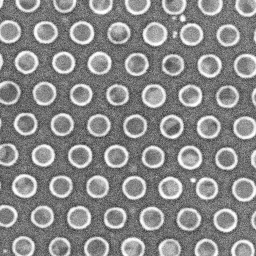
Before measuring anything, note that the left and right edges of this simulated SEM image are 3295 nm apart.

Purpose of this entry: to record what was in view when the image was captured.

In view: a regular array of raised bodies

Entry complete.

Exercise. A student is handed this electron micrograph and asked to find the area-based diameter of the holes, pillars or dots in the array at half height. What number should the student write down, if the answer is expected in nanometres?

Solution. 267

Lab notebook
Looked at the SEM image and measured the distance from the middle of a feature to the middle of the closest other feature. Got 456 nanometers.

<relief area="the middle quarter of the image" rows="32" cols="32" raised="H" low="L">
HHLLLLHHHHHHLLLLHHHHHLLLLHHHHHLL
HHLLLLLHHHHLLLLLHHHHLLLLLHHHHLLL
LLLLLLLLLLLLLLLLLHHLLLLLLLHHLLLL
LLLLLLLLLLLLLLLLLLLLLLLLLLLLLLLL
LLLLLLLLLLLLLLLLLLLLLLLLLLLLLLLL
LLLHHLLLLLLLHHLLLLLLLHHLLLLLLLLL
LLHHHHHLLLLHHHHHLLLLHHHHHLLLLLHH
LLHHHHHLLLLHHHHHLLLLHHHHHLLLLHHH
LLHHHHHLLLLHHHHHLLLLHHHHHLLLLHHH
LLLHHHLLLLLLHHHLLLLLHHHHHLLLLLHH
LLLLLLLLLLLLLLLLLLLLLLHLLLLLLLLL
LLLLLLLLLLLLLLLLLLLLLLLLLLLLLLLL
LLLLLLLLLLLLLLLLLLLLLLLLLLLLLLLL
HLLLLLLHHHLLLLLLHHHHLLLLLLHHLLLL
HHLLLLHHHHHLLLLHHHHHLLLLLHHHHLLL
HHLLLLHHHHHLLLLHHHHHLLLLHHHHHLLL
HHLLLLHHHHHLLLLHHHHHLLLLHHHHHLLL
HLLLLLLHHHLLLLLLHHHHLLLLLHHHHLLL
LLLLLLLLLLLLLLLLLLLLLLLLLLLLLLLL
LLLLLLLLLLLLLLLLLLLLLLLLLLLLLLLL
LLLLLLLLLLLLLLLLLLLLLLLLLLLLLLLL
LLHHHHLLLLLHHHHLLLLLLHHHLLLLLLHH
LHHHHHLLLLLHHHHHLLLLHHHHHLLLLHHH
LHHHHHHLLLHHHHHHLLLLHHHHHLLLLHHH
LLHHHHLLLLLHHHHLLLLLHHHHHLLLLHHH
LLLHHLLLLLLLHHLLLLLLLHHHLLLLLLHH
LLLLLLLLLLLLLLLLLLLLLLLLLLLLLLLL
LLLLLLLLLLLLLLLLLLLLLLLLLLLLLLLL
LLLLLLLHHHLLLLLLLHHLLLLLLLLLLLLL
HHLLLLHHHHHLLLLHHHHHLLLLLHHHLLLL
HHLLLLHHHHHLLLLHHHHHLLLLHHHHHLLL
HHLLLLHHHHHLLLLHHHHHLLLLHHHHHLLL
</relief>